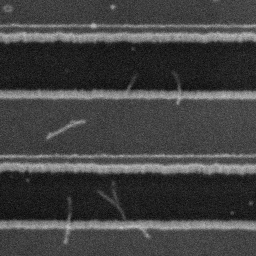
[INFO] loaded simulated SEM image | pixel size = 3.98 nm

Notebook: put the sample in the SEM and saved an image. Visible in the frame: lines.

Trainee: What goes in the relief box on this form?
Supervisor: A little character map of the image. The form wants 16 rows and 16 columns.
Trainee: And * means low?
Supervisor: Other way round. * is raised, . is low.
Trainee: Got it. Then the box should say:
****************
****************
................
................
................
................
****************
****************
****************
****************
......**..**.***
................
................
................
****************
****************